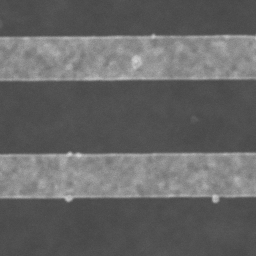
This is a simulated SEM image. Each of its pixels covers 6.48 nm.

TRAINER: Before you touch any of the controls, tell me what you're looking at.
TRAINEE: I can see wiring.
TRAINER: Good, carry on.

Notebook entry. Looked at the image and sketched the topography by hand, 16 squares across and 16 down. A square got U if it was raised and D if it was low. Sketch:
DDDDDDDDDDDDDDDD
DDDDDDDDDDDDDDDD
UUUUUUUUUUUUUUUU
UUUUUUUUUUUUUUUU
UUUUUUUUUUUUUUUU
DDDDDDDDDDDDDDDD
DDDDDDDDDDDDDDDD
DDDDDDDDDDDDDDDD
DDDDDDDDDDDDDDDD
DDDDDDDDDDDDDDDD
UUUUUUUUUUUUUUUU
UUUUUUUUUUUUUUUU
DDDDDDDDDDDDDDDD
DDDDDDDDDDDDDDDD
DDDDDDDDDDDDDDDD
DDDDDDDDDDDDDDDD